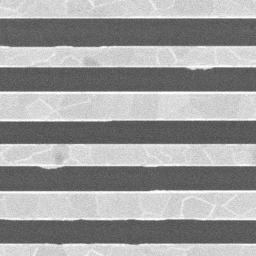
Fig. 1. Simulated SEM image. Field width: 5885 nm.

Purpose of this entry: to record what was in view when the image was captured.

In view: lines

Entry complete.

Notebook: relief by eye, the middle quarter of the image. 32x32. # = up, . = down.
################################
................................
................................
................................
................................
................................
................................
################################
################################
################################
################################
################################
################################
################################
................................
................................
................................
................................
................................
................................
################################
################################
################################
################################
################################
................................
................................
................................
................................
................................
................................
................................